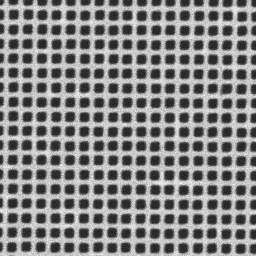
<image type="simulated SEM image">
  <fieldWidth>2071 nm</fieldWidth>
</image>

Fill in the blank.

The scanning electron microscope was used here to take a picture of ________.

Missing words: a regular array of holes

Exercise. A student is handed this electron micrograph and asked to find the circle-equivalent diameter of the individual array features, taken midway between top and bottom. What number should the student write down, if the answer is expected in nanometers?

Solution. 87.1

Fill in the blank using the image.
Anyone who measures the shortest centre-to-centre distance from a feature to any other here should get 14.1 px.